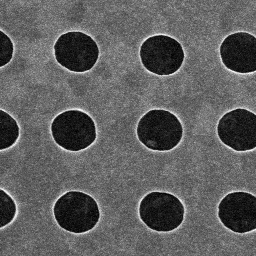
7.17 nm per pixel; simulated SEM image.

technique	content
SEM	holes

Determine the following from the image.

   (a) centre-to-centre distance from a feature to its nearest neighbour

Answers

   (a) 565 nanometers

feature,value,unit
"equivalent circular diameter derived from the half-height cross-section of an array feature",308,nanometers